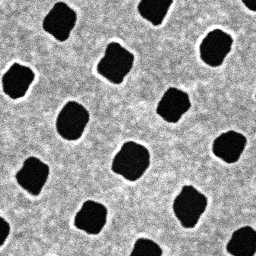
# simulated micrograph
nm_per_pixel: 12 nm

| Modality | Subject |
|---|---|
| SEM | a regular array of holes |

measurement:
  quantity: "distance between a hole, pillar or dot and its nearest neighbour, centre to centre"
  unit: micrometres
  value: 0.836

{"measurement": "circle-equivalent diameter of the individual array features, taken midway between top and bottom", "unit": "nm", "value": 411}